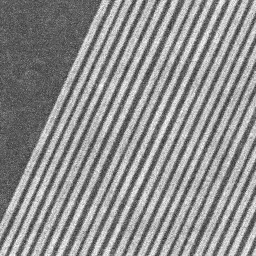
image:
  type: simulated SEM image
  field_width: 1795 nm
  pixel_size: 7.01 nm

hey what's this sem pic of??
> parallel lines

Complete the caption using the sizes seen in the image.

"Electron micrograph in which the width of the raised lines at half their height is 31.1 nm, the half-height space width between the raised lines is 43.1 nm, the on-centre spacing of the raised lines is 73.5 nanometres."